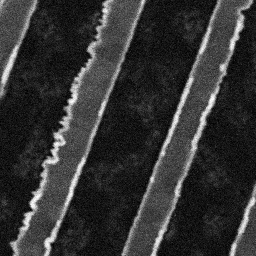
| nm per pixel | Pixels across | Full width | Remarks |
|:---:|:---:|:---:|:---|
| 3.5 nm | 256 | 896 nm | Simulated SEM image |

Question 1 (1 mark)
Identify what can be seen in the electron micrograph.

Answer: one or a few lines or trenches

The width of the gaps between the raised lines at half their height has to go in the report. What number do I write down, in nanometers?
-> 239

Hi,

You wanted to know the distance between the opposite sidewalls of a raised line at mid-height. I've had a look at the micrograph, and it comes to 112 nm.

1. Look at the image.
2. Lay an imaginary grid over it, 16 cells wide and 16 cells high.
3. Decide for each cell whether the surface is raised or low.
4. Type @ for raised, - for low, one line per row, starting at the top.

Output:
@@-----@@----@@-
@@----@@-----@@-
@-----@@-----@@-
@-----@@----@@--
@----@@-----@@--
-----@@-----@@--
----@@@----@@---
----@@-----@@---
----@@----@@----
---@@@----@@----
---@@-----@@----
---@@----@@-----
--@@-----@@-----
--@@-----@@----@
-@@@----@@-----@
-@@-----@@----@@